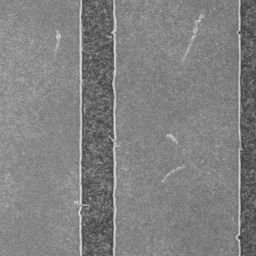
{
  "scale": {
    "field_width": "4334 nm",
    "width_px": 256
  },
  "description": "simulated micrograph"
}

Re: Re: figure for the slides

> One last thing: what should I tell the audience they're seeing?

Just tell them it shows one or a few lines or trenches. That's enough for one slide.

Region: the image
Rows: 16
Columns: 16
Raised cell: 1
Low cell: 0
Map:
1111100111111110
1111100111111110
1111100111111110
1111100111111110
1111100111111110
1111100111111110
1111100111111110
1111100111111110
1111100111111110
1111100111111110
1111100111111110
1111100111111110
1111100111111110
1111100111111110
1111100111111110
1111100111111110